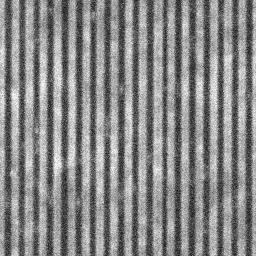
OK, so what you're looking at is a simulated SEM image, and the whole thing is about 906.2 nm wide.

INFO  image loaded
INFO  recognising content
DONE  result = parallel lines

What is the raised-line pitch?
50.2 nm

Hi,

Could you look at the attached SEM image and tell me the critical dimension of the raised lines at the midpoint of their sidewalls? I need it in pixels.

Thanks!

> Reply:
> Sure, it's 5.88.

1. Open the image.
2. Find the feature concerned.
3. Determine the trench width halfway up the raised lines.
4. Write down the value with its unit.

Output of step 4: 0.0296 microns